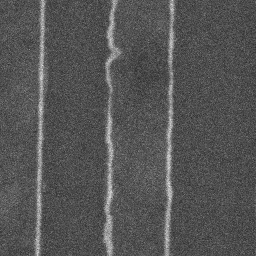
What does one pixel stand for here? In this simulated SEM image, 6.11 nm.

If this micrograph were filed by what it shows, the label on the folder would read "one or a few lines or trenches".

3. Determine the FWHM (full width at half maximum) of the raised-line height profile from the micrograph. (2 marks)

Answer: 60.8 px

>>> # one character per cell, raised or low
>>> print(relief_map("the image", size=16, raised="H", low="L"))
HHHLLLLHHHHLLLLL
HHHLLLLHHHHLLLLL
HHHLLLLHHHHLLLLL
HHHLLLLHHHHLLLLL
HHHLLLLHHHHLLLLL
HHHLLLLHHHHLLLLL
HHHLLLLHHHHLLLLL
HHHLLLLHHHHLLLLL
HHHLLLLHHHHLLLLL
HHHLLLLHHHHLLLLL
HHLLLLLHHHHLLLLL
HHLLLLLHHHHLLLLL
HHLLLLLHHHHLLLLL
HHLLLLLHHHHLLLLL
HHLLLLLHHHLLLLLL
HHLLLLLHHHLLLLLL